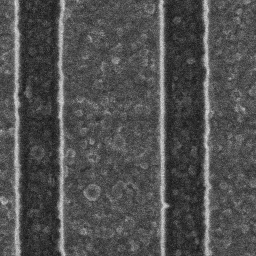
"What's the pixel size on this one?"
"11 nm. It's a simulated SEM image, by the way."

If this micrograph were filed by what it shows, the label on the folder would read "one or a few lines or trenches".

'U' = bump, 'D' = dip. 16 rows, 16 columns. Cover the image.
UDDDUUUUUUDDDUUU
UDDDUUUUUUDDDUUU
UDDDUUUUUUDDDUUU
UDDDUUUUUUDDDUUU
UDDDUUUUUUDDDUUU
UDDDUUUUUUDDDUUU
UDDDUUUUUUDDDUUU
UDDDUUUUUUDDDUUU
UDDDUUUUUUDDDUUU
UDDDUUUUUUDDDUUU
UDDDUUUUUUDDDUUU
UDDDUUUUUUDDDUUU
UDDDUUUUUUDDDUUU
UDDDUUUUUUDDDUUU
UDDDUUUUUUDDDUUU
UDDDUUUUUUDDDUUU